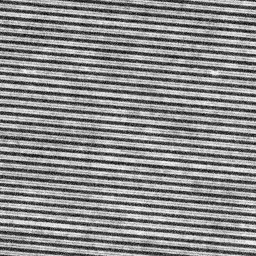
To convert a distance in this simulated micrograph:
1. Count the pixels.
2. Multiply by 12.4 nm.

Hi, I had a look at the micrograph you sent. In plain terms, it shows parallel lines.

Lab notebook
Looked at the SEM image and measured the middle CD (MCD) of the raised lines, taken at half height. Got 37 nanometers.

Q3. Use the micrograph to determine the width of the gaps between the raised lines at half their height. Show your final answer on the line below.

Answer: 4.86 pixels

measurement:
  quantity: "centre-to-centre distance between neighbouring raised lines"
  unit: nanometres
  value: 98.2